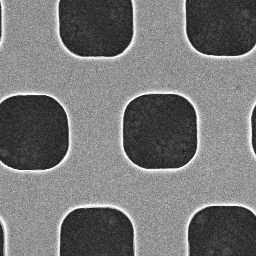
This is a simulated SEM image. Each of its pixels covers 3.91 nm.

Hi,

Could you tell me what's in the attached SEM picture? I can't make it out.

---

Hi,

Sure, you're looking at holes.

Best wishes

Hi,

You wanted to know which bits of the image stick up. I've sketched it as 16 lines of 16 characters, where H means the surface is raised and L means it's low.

HHHHLLLLHHHHLLLL
HHHHLLLLHHHHLLLL
HHHHLLLLHHHHLLLL
HHHHHLLHHHHHHHLH
HHHHHHHHHHHHHHHH
HHHHHHHHHHHHHHHH
LLLLHHHHLLLLHHHH
LLLLHHHHLLLLHHHH
LLLLHHHHLLLLHHHH
LLLLHHHHLLLLHHHH
HLLHHHHHHLLHHHHH
HHHHHHHHHHHHHHHH
HHHHHHHHHHHHHHHH
HHHHLLLLHHHHLLLL
HHHHLLLLHHHHLLLL
HHHHLLLLHHHHLLLL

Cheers